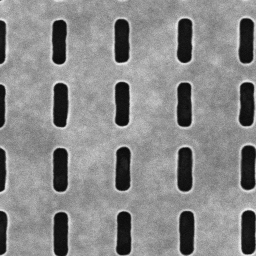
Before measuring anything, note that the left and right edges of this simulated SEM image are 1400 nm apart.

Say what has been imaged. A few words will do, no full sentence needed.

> a regular array of holes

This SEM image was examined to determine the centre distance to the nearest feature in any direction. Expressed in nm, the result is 339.